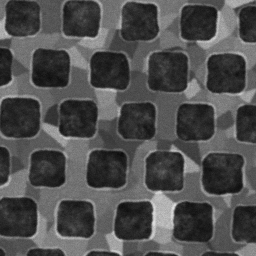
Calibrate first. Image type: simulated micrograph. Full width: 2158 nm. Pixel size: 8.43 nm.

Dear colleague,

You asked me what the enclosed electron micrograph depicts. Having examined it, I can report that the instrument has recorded a regular array of holes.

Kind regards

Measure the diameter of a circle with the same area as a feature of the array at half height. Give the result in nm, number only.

360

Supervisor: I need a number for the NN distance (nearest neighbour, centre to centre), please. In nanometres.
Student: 483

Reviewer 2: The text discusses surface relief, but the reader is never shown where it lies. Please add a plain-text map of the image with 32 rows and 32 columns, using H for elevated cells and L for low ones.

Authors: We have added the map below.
HLLLLHHHLLLLHHHHLLLHHHHHLHHHHHHH
HLLLLHHHLLLLLHHLLLLLHHHLLLLHHHLL
HLLLLHHHLLLLLHHLLLLLHHLLLLLHHHLL
HLLLLHHHLLLLHHHLLLLLHHLLLLLHHHLL
HLLLHHHHLLLLHHHLLLLLHHHLLLLHHHLL
HHHHHHHHHHHHHHHHHHHHHHHHHHHHHHHH
LHHHLLLLHHHHLLLHHHHLLLLHHHHHHHHH
LLHHLLLLLHHLLLLLHHLLLLLLHHLLLLLH
LHHHLLLLLHHLLLLLHHLLLLLLHHLLLLLH
LLHHLLLLLHHLLLLLHHLLLLLLHHLLLLLH
LHHHLLLLHHHLLLLLHHHLLLLLHHLLLLLH
HHHHHHHHHHHHHHHHHHHHLLLHHHLLLLHH
LLLLLHHHLLLHHHHHHHHHHHHHHHHHHHHH
LLLLLHHLLLLLHHHLLLLLHHLLLLLHHHLL
LLLLLHHLLLLLHHHLLLLLHHLLLLLHHLLL
LLLLLHHLLLLLHHHLLLLHHHLLLLLHHLLL
LLLLLHHLLLLLHHHLLLLHHHLLLLLHHLLL
HHHHHHHHHHHHHHHHHHHHHHHLLLHHHHLL
LHHHHHHHHHHHHHHHHHHHHHHHHHHHHHHH
LHHHLLLLHHHLLLLLHHLLLLLHHHLLLLHH
LHHHLLLLHHHLLLLLHHLLLLLHHLLLLLLH
LHHHLLLLHHHLLLLLHHLLLLLHHLLLLLHH
LHHHLLLLHHHLLLLLHHLLLLLHHLLLLLHH
HHHHHLLHHHHHLLLHHHLLLLLHHLLLLLHH
HHHHHHHHHHHHHHHHHHHHHHHHHHHHHHHH
LLLLLHHLLLLHHHHLLLLHHHLLLLHHHHHH
LLLLLHHLLLLLHHLLLLLHHHLLLLLHHLLL
LLLLLHHLLLLLHHLLLLLHHHLLLLLHHLLL
LLLLLHHLLLLLHHLLLLLHHHLLLLLHHLLL
LLLLHHHHLLLLHHLLLLLHHHLLLLLHHLLL
HHHHHHHHHHHHHHHHHHHHHHHHHHHHHHHH
LHHLLLLLHHHLLLHHHHHLLHHHHHLLHHHH